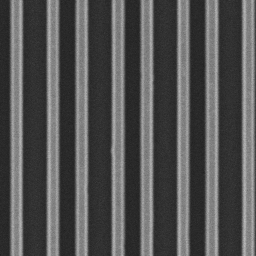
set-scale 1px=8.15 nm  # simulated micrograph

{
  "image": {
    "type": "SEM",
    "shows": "parallel lines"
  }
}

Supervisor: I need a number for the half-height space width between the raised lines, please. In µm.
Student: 0.211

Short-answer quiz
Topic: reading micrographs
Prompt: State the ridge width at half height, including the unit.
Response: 82.5 nm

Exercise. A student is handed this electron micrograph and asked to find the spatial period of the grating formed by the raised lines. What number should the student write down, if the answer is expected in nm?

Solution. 270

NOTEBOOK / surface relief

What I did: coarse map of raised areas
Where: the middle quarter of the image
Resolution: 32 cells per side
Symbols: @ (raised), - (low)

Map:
---@@@------@@@----@@@-------@@-
---@@@------@@@----@@@-------@@-
---@@@------@@@----@@@-------@@-
---@@@------@@@----@@@-------@@-
---@@@------@@@----@@@-------@@-
---@@@------@@@----@@@-------@@-
---@@@------@@@----@@@-------@@-
---@@@------@@@----@@@-------@@-
---@@@------@@@----@@@-------@@-
---@@@------@@@----@@@-------@@-
---@@@------@@@----@@@-------@@-
---@@@------@@@----@@@-------@@-
---@@@------@@@----@@@-------@@-
---@@@------@@@----@@@-------@@-
---@@@------@@@----@@@-------@@-
---@@@------@@@----@@@-------@@-
---@@@------@@@----@@@-------@@-
---@@@------@@@----@@@-------@@-
---@@@------@@@----@@@-------@@-
---@@@------@@@----@@@-------@@-
---@@@------@@@----@@@-------@@-
---@@@------@@@----@@@-------@@-
---@@@------@@@----@@@-------@@-
---@@@------@@@----@@@-------@@-
---@@@------@@@----@@@-------@@-
---@@@------@@@----@@@-------@@-
---@@@------@@@----@@@-------@@-
---@@@------@@@----@@@-------@@-
---@@@------@@@----@@@-------@@-
---@@@------@@@----@@@-------@@-
---@@@------@@@----@@@-------@@-
---@@-------@@@----@@@-------@@-